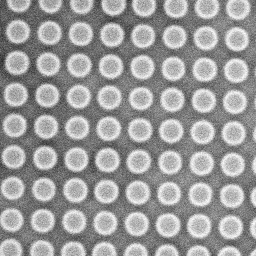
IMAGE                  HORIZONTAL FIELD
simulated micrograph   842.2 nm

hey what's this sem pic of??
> an array of small figures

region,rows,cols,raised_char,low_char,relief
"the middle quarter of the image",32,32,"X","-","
-XXXXXX--XXXXX---XXXXX---XXXXX--
-XXXXX---XXXXX---XXXXX---XXXXX--
--XXX-----XXXX---XXXXX---XXXXX--
--------------------------XXX---
--------------------------------
--------------------------------
--XXXX---XXXX-----XXX-----XX----
-XXXXX---XXXXX---XXXXX---XXXX---
-XXXXX---XXXXX---XXXXX--XXXXXX--
-XXXXX---XXXXX---XXXXX---XXXXX--
--XXX-----XXX----XXXX----XXXX---
--------------------------XX----
--------------------------------
--XX----------------------------
-XXXXX---XXXX----XXXX----XXX----
-XXXXX---XXXXX---XXXXX--XXXXX---
-XXXXX--XXXXXX--XXXXXX--XXXXX---
-XXXX----XXXX---XXXXXX--XXXXX---
----------XX-----XXXX----XXXX---
--------------------------------
--------------------------------
--XX------XX--------------------
-XXXX----XXXX----XXXX----XXX----
-XXXXX--XXXXXX--XXXXX---XXXXX---
-XXXXX--XXXXXX--XXXXX---XXXXX---
-XXXX----XXXX---XXXXX---XXXXX---
--XX------XX-----XXX-----XXX----
--------------------------------
--------------------------------
-XXXX----XXX--------------------
XXXXX---XXXXX---XXXXX---XXXX----
XXXXXX--XXXXX---XXXXX---XXXXX---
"